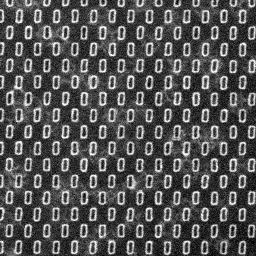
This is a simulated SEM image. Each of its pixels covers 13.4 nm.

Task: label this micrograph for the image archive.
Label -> a regular array of raised bodies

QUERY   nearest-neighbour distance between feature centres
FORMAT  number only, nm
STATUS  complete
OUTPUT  246